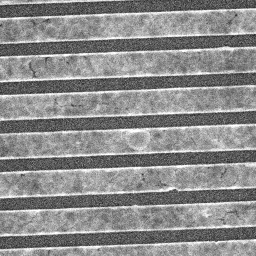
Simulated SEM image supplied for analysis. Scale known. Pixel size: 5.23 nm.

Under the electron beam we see parallel lines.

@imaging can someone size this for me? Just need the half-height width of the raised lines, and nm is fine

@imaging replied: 129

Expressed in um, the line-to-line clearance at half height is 0.0719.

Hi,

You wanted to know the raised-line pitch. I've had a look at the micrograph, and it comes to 201 nanometres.